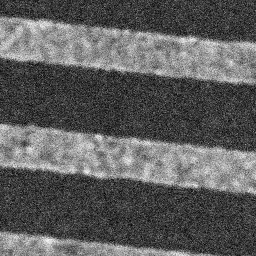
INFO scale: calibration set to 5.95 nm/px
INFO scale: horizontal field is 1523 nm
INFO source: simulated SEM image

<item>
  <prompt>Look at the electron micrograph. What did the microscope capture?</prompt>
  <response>one or a few lines or trenches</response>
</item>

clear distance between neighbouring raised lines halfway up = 409 nm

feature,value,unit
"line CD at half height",229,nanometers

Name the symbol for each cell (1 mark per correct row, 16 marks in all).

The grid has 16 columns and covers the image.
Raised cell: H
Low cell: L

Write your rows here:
LLLLLLLLLLLLLLLL
HHHHLLLLLLLLLLLL
HHHHHHHHHHHHLLLL
HHHHHHHHHHHHHHHH
LLLLLLLLLHHHHHHH
LLLLLLLLLLLLLLLL
LLLLLLLLLLLLLLLL
LLLLLLLLLLLLLLLL
HHHHHHLLLLLLLLLL
HHHHHHHHHHHHHHHL
LLHHHHHHHHHHHHHH
LLLLLLLLLLLHHHHH
LLLLLLLLLLLLLLLL
LLLLLLLLLLLLLLLL
LLLLLLLLLLLLLLLL
HHHHHHHHLLLLLLLL